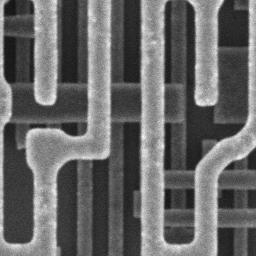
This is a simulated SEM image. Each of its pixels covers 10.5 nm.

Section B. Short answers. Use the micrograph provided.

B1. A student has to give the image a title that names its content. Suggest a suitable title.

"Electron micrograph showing wiring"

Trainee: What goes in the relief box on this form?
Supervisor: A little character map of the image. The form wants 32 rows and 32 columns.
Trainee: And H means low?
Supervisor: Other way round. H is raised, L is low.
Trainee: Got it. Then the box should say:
LLLLHHHLLLLHHHLLLLHHHLLLHHHHLLLH
LLLLHHHLLLLHHHLLLLHHLLLLHHHLLLLH
LLLLHHHLLLLHHHLLLLHHLLLLHHHLLLLH
LLLLHHHLLLLHHHLLLLHHLLLLHHHLLLLH
LLLLHHHLLLLHHHLLLLHHLLLLLHHLLLLH
LLLLHHHLLLLHHHLLLLHHLLLLLHHLLLLH
LLLLHHHLLLLHHHLLLLHHLLLLLHHLLLLH
LLLLHHHLLLLHHHLLLLHHLLLLLHHLLLLH
LLLLHHHLLLLHHHLLLLHHLLLLHHHLLLLH
LLLLHHHLLLLHHHLLLLHHLLLLHHHLLLLH
HLLLHHHLLLLHHHLLLLHHLLLLHHHLLLLH
HLLLHHHLLLLHHHLLLLHHLLLLHHHLLLLH
HLLLLHHLLLLHHHLLLLHHLLLLHHHLLLLH
HLLLLLLLLLLHHHLLLLHHLLLLLLLLLLLH
HLLLLLLLLLLHHHLLLLHHLLLLLLLLLLLH
HLLLLLLLLLLHHHLLLLHHLLLLLLLLLLLH
LLLLHHHHLLLHHHLLLLHHLLLLLLLLLLHH
LLLHHHHHHHHHHHLLLLHHLLLLLLLLHHHH
LLLHHHHHHHHHHHLLLLHHLLLLLLLHHHHH
LLLHHHHHHHHHHLLLLLHHLLLLLLHHHHHL
LLLLHHHHLLLLLLLLLLHHLLLLLHHHHLLL
LLLLHHHLLLLLLLLLLLHHLLLLHHHHLLLL
LLLLHHHLLLLLLLLLLLHHLLLLHHHLLLLL
LLLLHHHLLLLLLLLLLLHHLLLLHHHLLLLL
LLLLHHHLLLLLLLLLLLHHLLLLHHHLLLLL
LLLLHHHLLLLLLLLLLLHHLLLLHHHLLLLL
LLLLHHHLLLLLLLLLLLHHLLLLHHHLLLLL
LLLLHHHLLLLLLLLLLLHHLLLLHHHLLLLL
LLLLHHHLLLLLLLLLLLHHLLLLHHHLLLLL
LLLLHHHLLLLLLLLLLLHHLLLLHHHLLLLL
HHLHHHHLLLLLLLLLLLHHHLLHHHHLLLLL
HHHHHHHLLLLLLLLLLLHHHHHHHHHLLLLL